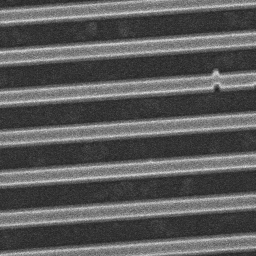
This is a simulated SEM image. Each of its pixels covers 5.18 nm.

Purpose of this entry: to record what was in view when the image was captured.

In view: parallel lines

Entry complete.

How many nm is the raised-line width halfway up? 76.9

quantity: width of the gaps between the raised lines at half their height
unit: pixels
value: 25.3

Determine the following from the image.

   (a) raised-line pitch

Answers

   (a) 0.209 micrometres